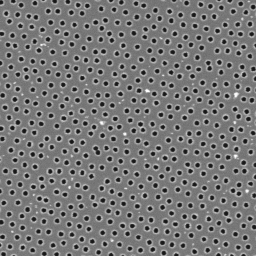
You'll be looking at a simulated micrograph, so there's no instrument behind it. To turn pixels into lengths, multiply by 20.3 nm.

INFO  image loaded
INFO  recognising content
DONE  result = a regular array of holes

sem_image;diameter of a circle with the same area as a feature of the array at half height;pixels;4.65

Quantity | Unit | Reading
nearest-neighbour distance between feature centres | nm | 199